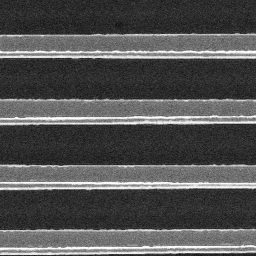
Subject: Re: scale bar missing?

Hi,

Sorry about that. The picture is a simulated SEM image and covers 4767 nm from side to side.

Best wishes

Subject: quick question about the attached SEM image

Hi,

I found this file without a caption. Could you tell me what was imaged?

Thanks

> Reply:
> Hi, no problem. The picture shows lines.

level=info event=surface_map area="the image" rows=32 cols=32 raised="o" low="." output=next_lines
................................
................................
................................
................................
oooooooooooooooooooooooooooooooo
oooooooooooooooooooooooooooooooo
oooooooooooooooooooooooooooooooo
................................
................................
................................
................................
................................
................................
oooooooooooooooooooooooooooooooo
oooooooooooooooooooooooooooooooo
................................
................................
................................
................................
................................
................................
oooooooooooooooooooooooooooooooo
oooooooooooooooooooooooooooooooo
ooooooooooooooooooo.............
................................
................................
................................
................................
................................
oooooooooooooooooooooooooooooooo
oooooooooooooooooooooooooooooooo
ooooooooooooooooooooooooooooooo.